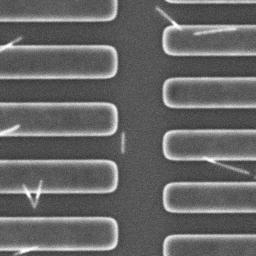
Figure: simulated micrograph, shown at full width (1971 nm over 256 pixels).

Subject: groups of lines, slits or small figures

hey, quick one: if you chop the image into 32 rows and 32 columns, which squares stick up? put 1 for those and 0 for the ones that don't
11111111111111000000000000000000
11111111111111000000000000000000
11111111111110000000000000000000
00000000000000000000011111111111
00000000000000000000111111111111
00000000000000000000111111111111
11111111111111000000011111111111
11111111111111100000000000000000
11111111111111100000000000000000
11111111111111000000000000000000
00000000000000000000011111111111
00000000000000000000111111111111
00000000000000000000111111111111
11111111111111000000000000000000
11111111111111100000000000000000
11111111111111100000000000000000
11111111111111000000011111111111
00000000000000000000111111111111
00000000000000000000111111111111
00000000000000000000011111111111
11111111111111000000000000000000
11111111111111100000000000000000
11111111111111100000000000000000
11111111111111000000011111111111
00000000000000000000111111111111
00000000000000000000111111111111
00000000000000000000000000000000
11111111111111000000000000000000
11111111111111100000000000000000
11111111111111100000001111111111
11111111111111000000011111111111
00000000000000000000111111111111